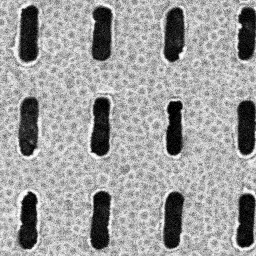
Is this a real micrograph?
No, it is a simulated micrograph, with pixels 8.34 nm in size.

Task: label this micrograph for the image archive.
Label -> a regular array of holes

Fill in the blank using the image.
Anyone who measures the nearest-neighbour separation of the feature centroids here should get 600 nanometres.